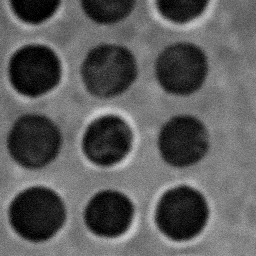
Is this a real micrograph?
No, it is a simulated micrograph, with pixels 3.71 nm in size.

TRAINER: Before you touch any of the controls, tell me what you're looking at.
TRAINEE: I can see a regular array of holes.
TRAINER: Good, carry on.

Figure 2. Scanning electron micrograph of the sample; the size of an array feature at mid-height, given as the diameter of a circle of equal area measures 0.204 microns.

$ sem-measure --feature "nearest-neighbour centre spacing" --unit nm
266